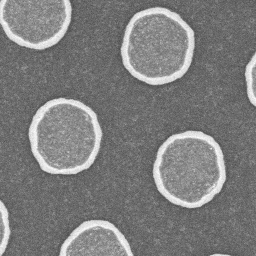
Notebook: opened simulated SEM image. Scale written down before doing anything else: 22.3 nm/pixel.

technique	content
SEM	raised bodies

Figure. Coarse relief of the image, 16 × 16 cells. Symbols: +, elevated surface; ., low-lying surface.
++++............
++++....+++.....
.++.....++++....
........++++....
........+++.....
................
...++...........
..++++..........
..++++.....++...
..++++....++++..
...++.....++++..
..........++++..
...........++...
................
.....++.........
....++++........